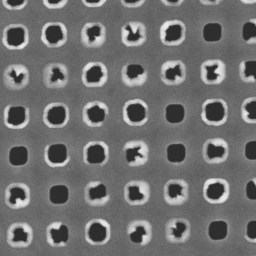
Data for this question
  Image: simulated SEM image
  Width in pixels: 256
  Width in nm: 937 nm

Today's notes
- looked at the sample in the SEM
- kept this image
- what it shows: a regular array of holes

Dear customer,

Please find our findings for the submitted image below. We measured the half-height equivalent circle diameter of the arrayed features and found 68.9 nanometres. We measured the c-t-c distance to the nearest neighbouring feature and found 143 nm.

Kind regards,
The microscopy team